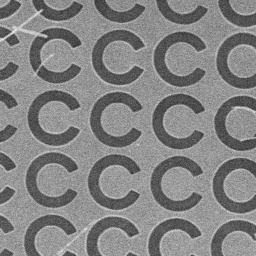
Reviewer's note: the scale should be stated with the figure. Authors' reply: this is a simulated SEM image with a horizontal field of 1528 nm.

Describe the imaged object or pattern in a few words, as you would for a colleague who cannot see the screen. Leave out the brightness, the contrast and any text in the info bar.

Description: an array of small figures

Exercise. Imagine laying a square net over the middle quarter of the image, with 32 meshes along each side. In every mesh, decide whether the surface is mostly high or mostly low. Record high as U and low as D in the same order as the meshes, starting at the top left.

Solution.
UDDDUUUDDDUUUUUUUDDUUUDDDDUUUUUU
DDDDUUUUDDDUUUUUDDDDUUUDDDUUUUUU
DDDDUUUUDDDDDDDDDDDDUUUDDDDDUUUD
DDDUUUUUUDDDDDDDDDDUUUUUDDDDDDDD
DUUUUUUUUUDDDDDDDUUUUUUUUDDDDDDD
UUUUUUUUUUUUUUUUUUUUUUUUUUUDDDDU
UUUUUUUUUUUUUUUUUUUUUUUUUUUUUUUU
DUUUUUUUUUDDDDDDUUUUUUUUUUUDDDDU
DDDUUUUUUDDDDDDDDDUUUUUUUDDDDDDD
DDDDUUUUDDDDDDDDDDDUUUUUDDDDDDDD
UDDDUUUDDDDUUUUUDDDDUUUDDDDUUUDD
UUDUUUUDDDUUUUUUUDDUUUUDDDUUUUUU
UUUUUUDDDDUUUUUUUUUUUUDDDUUUUUUU
UUUUUUDDDUUUUUUUUUUUUUDDDUUUUUUU
UUUUUUDDDUUUUUUUUUUUUUDDDUUUUUUU
UDUUUUDDDDUUUUUUUUUUUUDDDUUUUUUU
DDDDUUUDDDUUUUUUUDDUUUDDDUUUUUUU
DDDDUUUDDDDUUUUDDDDUUUUDDDUUUUUU
DDDUUUUUDDDDDDDDDDDUUUUDDDDDDDDD
DDUUUUUUUDDDDDDDDDUUUUUUDDDDDDDD
UUUUUUUUUUUDDDDDUUUUUUUUUDDDDDDD
UUUUUUUUUUUUUUUUUUUUUUUUUUUUDUUU
UUUUUUUUUUUUDDUUUUUUUUUUUUUUUUUU
DDUUUUUUUDDDDDDDDUUUUUUUUUDDDDDU
DDDUUUUUDDDDDDDDDDUUUUUUDDDDDDDD
DDDUUUUDDDDDUDDDDDDUUUUDDDDDDDDD
UDDUUUUDDDUUUUUUDDDUUUDDDDUUUUUD
UUUUUUDDDUUUUUUUDDUUUUDDDUUUUUUU
UUUUUUDDDUUUUUUUUUUUUUDDDUUUUUUU
UUUUUUDDDUUUUUUUUUUUUDDDUUUUUUUU
UUUUUUDDDUUUUUUUUUUUUDDDUUUUUUUU
UDUUUUDDDUUUUUUUUUUUUUDDDUUUUUUU